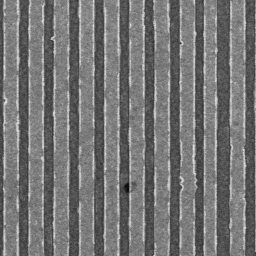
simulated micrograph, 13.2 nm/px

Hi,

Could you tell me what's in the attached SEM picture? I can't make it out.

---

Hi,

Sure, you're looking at parallel lines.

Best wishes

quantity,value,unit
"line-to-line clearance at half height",136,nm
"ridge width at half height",200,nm